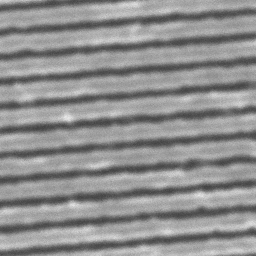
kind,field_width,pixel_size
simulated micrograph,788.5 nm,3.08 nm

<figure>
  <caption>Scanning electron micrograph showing parallel lines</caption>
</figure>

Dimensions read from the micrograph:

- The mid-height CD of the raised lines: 0.0429 micrometres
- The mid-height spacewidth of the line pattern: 10.2 pixels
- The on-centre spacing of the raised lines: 75.5 nanometres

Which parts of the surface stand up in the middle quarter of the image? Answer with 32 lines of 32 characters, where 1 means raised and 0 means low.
11111111111111000000000000000000
11110000000000000000000000000000
00000000000000000000000101111111
00000000000111111111111111111111
11111111111111111111111111111111
11111111111111111111111111111000
11111111111111111100000000000000
11110000000000000000000000000000
00000000000000000000000011110111
00000000010000110111111111111111
11111111111111111111111111111111
11111111111111111111111111111001
11111111111111111000000000000000
11111111000000000000000000000000
00000000000000000000000001111111
00000000000010001111111111111111
00011111111111111111111111111111
11111111111111111111111111111111
11111111111111111111100000000000
11111111101000000000000000000000
00000000000000000000000000001101
00000000000000001001111111111111
00001111111111111111111111111111
11111111111111111111111111111111
11111111111111111111111000000000
11111111111000000000000000000000
00000000000000000000000000000000
00000000000000110000111111111111
00000100111111111111111111111111
11111111111111111111111111111111
11111111111111111111111111011000
11111111111111000000000000000000